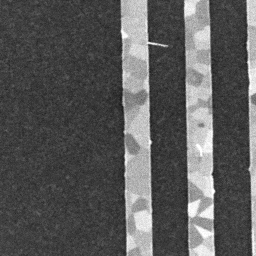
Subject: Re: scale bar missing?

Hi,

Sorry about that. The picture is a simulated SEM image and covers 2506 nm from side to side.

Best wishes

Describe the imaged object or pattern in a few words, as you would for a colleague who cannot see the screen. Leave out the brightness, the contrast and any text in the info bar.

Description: one or a few lines or trenches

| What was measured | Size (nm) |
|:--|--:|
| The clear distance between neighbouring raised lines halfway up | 371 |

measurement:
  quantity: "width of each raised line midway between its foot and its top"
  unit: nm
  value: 243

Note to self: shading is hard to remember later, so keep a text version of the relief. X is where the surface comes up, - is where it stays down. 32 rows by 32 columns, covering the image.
---------------XXX-----XXX-----X
---------------XXX-----XXX-----X
---------------XXX-----XXX-----X
---------------XXX-----XXX-----X
---------------XXX-----XXX-----X
---------------XXXX----XXX-----X
---------------XXX-----XXX-----X
---------------XXXX----XXX-----X
---------------XXXX----XXX-----X
---------------XXXX----XXX-----X
---------------XXXX----XXX-----X
---------------XXXX----XXX-----X
---------------XXXX----XXX-----X
---------------XXXX----XXX-----X
----------------XXX----XXX-----X
----------------XXX----XXX-----X
----------------XXX----XXX-----X
----------------XXX----XXX-----X
----------------XXX-----XX-----X
----------------XXX-----XX-----X
----------------XXX-----XX-----X
----------------XXX-----XX-----X
----------------XXX-----XXX----X
----------------XXX-----XXX-----
----------------XXX-----XXX----X
----------------XXX-----XXX----X
----------------XXX-----XXX-----
----------------XXX-----XXX-----
----------------XXX-----XXX-----
----------------XXX-----XXX-----
----------------XXX-----XXX-----
----------------XXX-----XXX-----